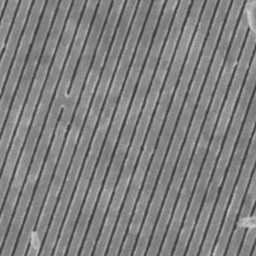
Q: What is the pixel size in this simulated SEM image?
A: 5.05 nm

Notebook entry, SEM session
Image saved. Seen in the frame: parallel lines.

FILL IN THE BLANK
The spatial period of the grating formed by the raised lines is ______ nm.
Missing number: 63.3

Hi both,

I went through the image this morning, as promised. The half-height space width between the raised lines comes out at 17.3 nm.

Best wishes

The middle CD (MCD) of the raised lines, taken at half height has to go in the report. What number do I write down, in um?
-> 0.0478